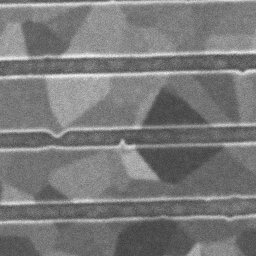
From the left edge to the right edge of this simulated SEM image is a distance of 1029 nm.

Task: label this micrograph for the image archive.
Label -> one or a few lines or trenches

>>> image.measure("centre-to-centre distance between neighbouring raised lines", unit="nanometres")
290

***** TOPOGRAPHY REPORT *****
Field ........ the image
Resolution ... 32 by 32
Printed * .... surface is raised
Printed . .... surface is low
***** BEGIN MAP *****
........************************
********************************
********************************
********************************
********************************
********************************
********************************
................................
................................
...*...*************************
********************************
********************************
********************************
********************************
********************************
********************************
......**........................
................................
.....***.***********************
********************************
********************************
********************************
********************************
********************************
********************************
................................
................................
...........*..******************
********************************
********************************
********************************
********************************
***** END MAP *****